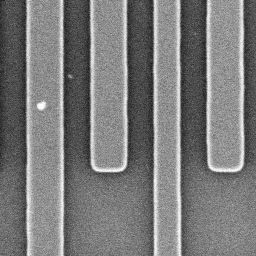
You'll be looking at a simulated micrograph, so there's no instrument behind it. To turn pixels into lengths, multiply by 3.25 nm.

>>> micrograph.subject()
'wiring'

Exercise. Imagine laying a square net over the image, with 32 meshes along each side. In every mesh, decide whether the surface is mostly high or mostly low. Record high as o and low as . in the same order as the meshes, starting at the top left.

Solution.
...ooooo...ooooo...ooo....oooo..
...ooooo...ooooo...ooo....oooo..
...ooooo...ooooo...ooo....oooo..
...ooooo...ooooo...ooo....oooo..
...ooooo...ooooo...ooo....oooo..
...ooooo...ooooo...ooo....oooo..
...ooooo...ooooo...ooo....oooo..
...ooooo...ooooo...ooo....oooo..
...ooooo...ooooo...ooo....oooo..
...ooooo...ooooo...ooo....oooo..
...ooooo...ooooo...ooo....oooo..
...ooooo...ooooo...ooo....oooo..
...ooooo...ooooo...ooo....oooo..
...ooooo...ooooo...ooo....oooo..
...ooooo...ooooo...ooo....oooo..
...ooooo...ooooo...ooo....oooo..
...ooooo...ooooo...ooo....oooo..
...ooooo...ooooo...ooo....oooo..
...ooooo...ooooo...ooo....oooo..
....oooo...ooooo...ooo....oooo..
...ooooo...ooooo...ooo....oooo..
...ooooo...........ooo..........
...ooooo...........ooo..........
...ooooo...........ooo..........
...ooooo...........oooo.........
...ooooo...........oooo.........
...ooooo...........oooo.........
...ooooo...........oooo.........
...ooooo...........oooo.........
....oooo...........oooo.........
....oooo...........oooo.........
....oooo...........oooo.........